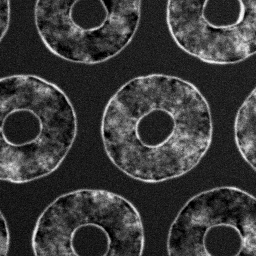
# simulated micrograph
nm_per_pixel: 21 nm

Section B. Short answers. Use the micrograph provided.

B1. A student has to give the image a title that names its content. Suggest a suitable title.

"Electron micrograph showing ring-shaped grooves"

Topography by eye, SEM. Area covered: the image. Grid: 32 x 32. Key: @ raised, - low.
-@@@@----@@@@----@@@@-----@@@@--
-@@@-----@@@@----@@@@----@@@@@--
-@@@@----@@@@----@@@@-----@@@@--
-@@@@-----@@-----@@@@-----------
@@@@@-----------@@@@@@----------
@@@@@@----------@@@@@@----------
@@@@@@@--------@@@@@@@@---------
@@@@@@@@@----@@@@@@@@@@@@@----@@
@@@@@@@@@@@@@@@@@@@@@@@@@@@@@@@@
@@--@@@@@@@@@@@@@@@-@@@@@@@@@@@@
------@@@@@@@@@@--------@@@@@@@@
--------@@@@@@@----------@@@@@@@
--------@@@@@@-----------@@@@@@-
---------@@@@-------------@@@@--
-@@@@----@@@@-----@@@@----@@@@--
@@@@@----@@@@----@@@@@----@@@@--
@@@@@----@@@@----@@@@@----@@@@--
-@@@-----@@@@----@@@@-----@@@@--
---------@@@@-------------@@@@--
--------@@@@@@-----------@@@@@@-
-------@@@@@@@----------@@@@@@@-
------@@@@@@@@@@-------@@@@@@@@@
@@-@@@@@@@@@@@@@@@--@@@@@@@@@@@@
@@@@@@@@@@@@@@@@@@@@@@@@@@@@@@@@
@@@@@@@@-------@@@@@@@@@@------@
@@@@@@@---------@@@@@@@---------
@@@@@@-----------@@@@@@---------
@@@@@------------@@@@@----------
-@@@@-----@@@-----@@@-----@@@@--
-@@@-----@@@@-----@@@----@@@@@--
-@@@-----@@@@@----@@@-----@@@@--
-@@@-----@@@@-----@@@-----@@@@--